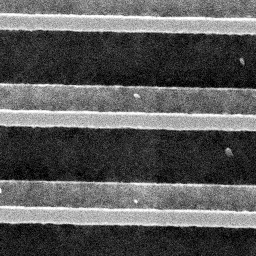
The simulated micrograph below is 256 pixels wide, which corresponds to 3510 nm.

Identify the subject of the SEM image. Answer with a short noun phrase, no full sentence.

lines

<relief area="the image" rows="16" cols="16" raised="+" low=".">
++++++++++++++++
++++++++++++++++
................
................
................
+++++++++++.....
++++++++++++++++
++++++++++++++++
................
................
................
+++++++++.......
++++++++++++++++
++++++++++++++++
................
................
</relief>